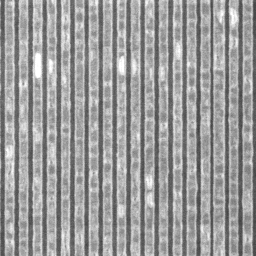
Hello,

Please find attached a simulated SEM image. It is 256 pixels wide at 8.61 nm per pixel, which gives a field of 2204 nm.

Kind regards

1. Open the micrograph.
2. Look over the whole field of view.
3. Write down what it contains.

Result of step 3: parallel lines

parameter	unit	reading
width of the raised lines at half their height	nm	77.5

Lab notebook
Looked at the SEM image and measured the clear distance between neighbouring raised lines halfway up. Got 46.3 nm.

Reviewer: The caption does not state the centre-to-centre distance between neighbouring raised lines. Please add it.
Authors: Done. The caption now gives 121 nm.